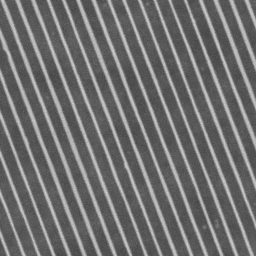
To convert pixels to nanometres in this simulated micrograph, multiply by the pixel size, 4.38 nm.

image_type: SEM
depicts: parallel lines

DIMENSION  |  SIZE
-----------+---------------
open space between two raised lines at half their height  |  11.4 pixels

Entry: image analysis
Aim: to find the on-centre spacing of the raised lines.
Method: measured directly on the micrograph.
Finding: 62.3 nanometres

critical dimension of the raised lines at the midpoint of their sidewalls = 2.67 px